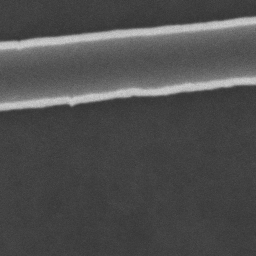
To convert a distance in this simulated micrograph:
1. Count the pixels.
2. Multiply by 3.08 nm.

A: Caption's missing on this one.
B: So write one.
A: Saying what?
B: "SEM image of one or a few lines or trenches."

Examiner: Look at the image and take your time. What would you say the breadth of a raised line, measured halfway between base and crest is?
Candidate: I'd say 188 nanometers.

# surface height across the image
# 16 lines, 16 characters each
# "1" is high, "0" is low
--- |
0000000000000000
0000000000000011
0000111111111111
1111111111111111
1111111111111111
1111111111100000
1100000000000000
0000000000000000
0000000000000000
0000000000000000
0000000000000000
0000000000000000
0000000000000000
0000000000000000
0000000000000000
0000000000000000